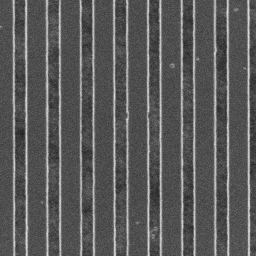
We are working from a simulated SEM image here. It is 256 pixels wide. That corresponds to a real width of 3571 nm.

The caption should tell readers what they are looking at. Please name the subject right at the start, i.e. parallel lines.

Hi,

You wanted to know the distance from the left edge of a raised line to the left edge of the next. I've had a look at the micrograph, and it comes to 469 nanometres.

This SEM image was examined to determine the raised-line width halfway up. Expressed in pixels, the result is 21.4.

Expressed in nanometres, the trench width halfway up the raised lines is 173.